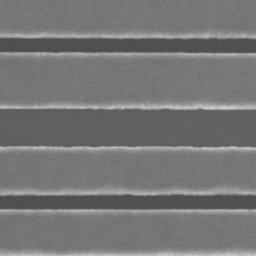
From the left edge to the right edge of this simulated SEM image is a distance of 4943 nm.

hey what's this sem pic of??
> lines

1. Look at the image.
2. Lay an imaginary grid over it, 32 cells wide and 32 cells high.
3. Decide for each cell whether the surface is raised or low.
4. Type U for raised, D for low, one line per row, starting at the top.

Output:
UUUUUUUUUUUUUUUUUUUUUUUUUUUUUUUU
UUUUUUUUUUUUUUUUUUUUUUUUUUUUUUUU
UUUUUUUUUUUUUUUUUUUUUUUUUUUUUUUU
UUUUUUUUUUUUUUUUUUUUUUUUUUUUUUUU
UUUUUUUUUUUUUUUUUUUUUUUUUUUUUUUU
DDDDDDDDDDDDDDDDDDDDDDDDDDDDDDDD
DDDDDDDDDDDDDDDDDDDDDDDDDDDDDDDD
UUUUUUUUUUUUUUUUUUUUUUUUUUUUUUUU
UUUUUUUUUUUUUUUUUUUUUUUUUUUUUUUU
UUUUUUUUUUUUUUUUUUUUUUUUUUUUUUUU
UUUUUUUUUUUUUUUUUUUUUUUUUUUUUUUU
UUUUUUUUUUUUUUUUUUUUUUUUUUUUUUUU
UUUUUUUUUUUUUUUUUUUUUUUUUUUUUUUU
UUUUUUUUUUUUUUUUUUUUUUUUUUUUUUUU
DDDDDDDDDDDDDDDDDDDDDDDDDDDDDDDD
DDDDDDDDDDDDDDDDDDDDDDDDDDDDDDDD
DDDDDDDDDDDDDDDDDDDDDDDDDDDDDDDD
DDDDDDDDDDDDDDDDDDDDDDDDDDDDDDDD
UUUUUUUUUUUUUUUUUUUUUUUUUUUUUUUU
UUUUUUUUUUUUUUUUUUUUUUUUUUUUUUUU
UUUUUUUUUUUUUUUUUUUUUUUUUUUUUUUU
UUUUUUUUUUUUUUUUUUUUUUUUUUUUUUUU
UUUUUUUUUUUUUUUUUUUUUUUUUUUUUUUU
UUUUUUUUUUUUUUUUUUUUUUUUUUUUUUUU
DDDDDDDDDDDDDDDDDDDDDDDDDDDDDDDD
DDDDDDDDDDDDDDDDDDDDDDDDDDDDDDDD
UUUUUUUUUUUUUUUUUUUUUUUUUUUUUUUU
UUUUUUUUUUUUUUUUUUUUUUUUUUUUUUUU
UUUUUUUUUUUUUUUUUUUUUUUUUUUUUUUU
UUUUUUUUUUUUUUUUUUUUUUUUUUUUUUUU
UUUUUUUUUUUUUUUUUUUUUUUUUUUUUUUU
UUUUUUUUUUUUUUUUUUUUUUUUUUUUUUUU